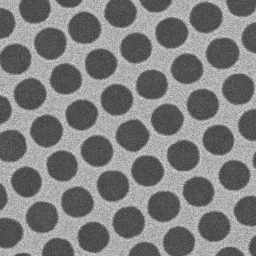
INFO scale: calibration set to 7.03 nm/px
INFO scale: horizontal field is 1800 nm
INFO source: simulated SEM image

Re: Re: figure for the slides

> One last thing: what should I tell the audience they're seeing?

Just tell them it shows a regular array of holes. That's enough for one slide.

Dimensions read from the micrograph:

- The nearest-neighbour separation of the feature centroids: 0.268 micrometres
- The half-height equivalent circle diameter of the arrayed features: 226 nanometres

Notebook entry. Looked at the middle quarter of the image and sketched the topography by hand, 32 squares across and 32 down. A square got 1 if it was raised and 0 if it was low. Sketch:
00111000000001111111111111100000
00001100000001111111100111100000
00001100000011111110000001100000
00000110000111111100000000100000
00000111111111111100000000111000
00001111111000011100000000111111
00011111110000000100000000111111
00111111100000000110000001111111
11111111100000000111000011111110
11000001100000000111111111111110
10000000100000000111111100001110
10000000110000001111110000000110
00000000011000011111110000000010
00000000111111111111110000000011
10000000111111100001110000000011
10000001111111000000110000000111
11100011111110000000011000000111
11111111111110000000011100001111
11111100000110000000011111111111
11111000000010000000011111110000
11110000000011000000111111100000
11110000000011100001111111000000
00110000000011111111111111000000
00011000000011111100000111000000
00011000000111111000000011000000
00001110001111111000000001100000
00011111111011111000000001110000
00011111100000011000000001111111
00111111100000001000000001111111
11111111000000001100000011111100
11111111000000001111001111111100
10000011000000001111111111111100